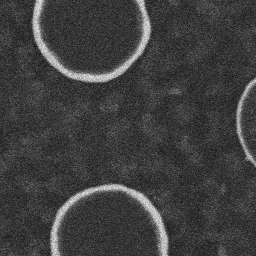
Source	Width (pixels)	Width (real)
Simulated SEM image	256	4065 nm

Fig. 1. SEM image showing raised bodies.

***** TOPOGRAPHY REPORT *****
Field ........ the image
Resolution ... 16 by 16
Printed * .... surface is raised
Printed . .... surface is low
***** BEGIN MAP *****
..*******.......
..*******.......
..*******.......
...******.......
....***.........
................
................
................
................
................
................
................
.....****.......
....******......
...*******......
...*******......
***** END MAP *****